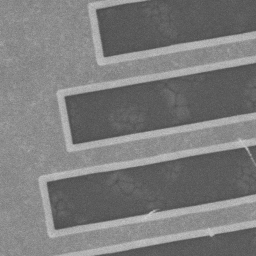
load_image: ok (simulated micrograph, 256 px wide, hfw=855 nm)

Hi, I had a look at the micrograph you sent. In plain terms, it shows one or a few lines or trenches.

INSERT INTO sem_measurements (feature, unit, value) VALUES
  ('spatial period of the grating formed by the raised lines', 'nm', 270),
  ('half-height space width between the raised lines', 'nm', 187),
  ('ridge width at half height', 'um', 0.0813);